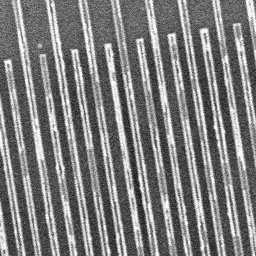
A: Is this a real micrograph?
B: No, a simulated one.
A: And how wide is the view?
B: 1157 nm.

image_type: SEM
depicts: parallel lines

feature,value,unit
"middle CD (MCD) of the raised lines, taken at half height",0.0284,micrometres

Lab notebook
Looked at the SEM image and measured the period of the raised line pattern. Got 0.0748 um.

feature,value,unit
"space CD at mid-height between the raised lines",44.7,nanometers